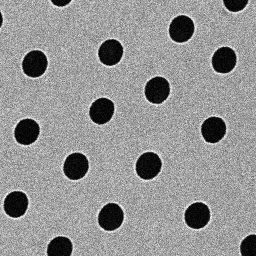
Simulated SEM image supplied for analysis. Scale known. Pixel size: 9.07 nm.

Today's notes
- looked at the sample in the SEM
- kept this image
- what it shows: a regular array of holes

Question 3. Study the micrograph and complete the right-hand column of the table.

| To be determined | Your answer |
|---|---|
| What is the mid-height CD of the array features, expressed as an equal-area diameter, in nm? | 241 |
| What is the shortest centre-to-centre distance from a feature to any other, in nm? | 543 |